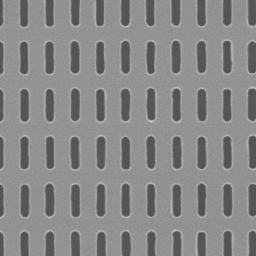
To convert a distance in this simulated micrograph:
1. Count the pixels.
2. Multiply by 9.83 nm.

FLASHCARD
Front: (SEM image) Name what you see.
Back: a regular array of holes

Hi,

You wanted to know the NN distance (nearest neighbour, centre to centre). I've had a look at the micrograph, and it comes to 247 nm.